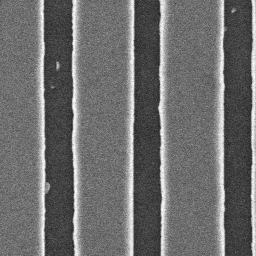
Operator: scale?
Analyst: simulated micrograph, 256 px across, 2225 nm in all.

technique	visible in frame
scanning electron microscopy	lines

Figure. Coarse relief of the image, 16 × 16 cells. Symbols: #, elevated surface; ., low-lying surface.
###..###..####..
###..###..####..
###..###..####..
###..###..####..
###..###..####..
###..###..####..
###..###..####..
###..###..####..
###..###..####..
###..###..####..
###..###..####..
###..###..####..
###..###..####..
###..###..####..
###..###..####..
###..###..####..